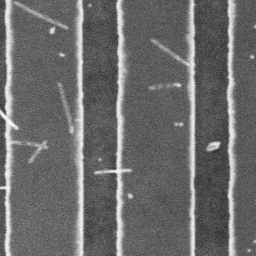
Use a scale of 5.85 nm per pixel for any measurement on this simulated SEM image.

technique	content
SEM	lines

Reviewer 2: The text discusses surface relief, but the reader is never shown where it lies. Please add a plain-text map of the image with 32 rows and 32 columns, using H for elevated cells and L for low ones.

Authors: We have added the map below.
LHHHHHHHHHLLLLLHHHHHHHHHLLLLLHHH
LHHHHHHHHHLLLLLHHHHHHHHHLLLLLHHH
LHHHHHHHHHLLLLLHHHHHHHHHLLLLLHHH
LHHHHHHHHHLLLLLHHHHHHHHHLLLLLHHH
LHHHHHHHHHLLLLLHHHHHHHHHLLLLLHHH
LHHHHHHHHHLLLLLHHHHHHHHHLLLLLHHH
LHHHHHHHHHLLLLLHHHHHHHHHLLLLLHHH
LHHHHHHHHHLLLLLHHHHHHHHHLLLLLHHH
LHHHHHHHHHLLLLLHHHHHHHHHLLLLLHHH
LHHHHHHHHHLLLLLHHHHHHHHHLLLLLHHH
LHHHHHHHHHLLLLLHHHHHHHHHLLLLLHHH
LHHHHHHHHHLLLLLHHHHHHHHHLLLLLHHH
LHHHHHHHHHLLLLLHHHHHHHHHLLLLLHHH
LHHHHHHHHHLLLLLHHHHHHHHHLLLLLHHH
LHHHHHHHHHLLLLLHHHHHHHHHLLLLLHHH
LHHHHHHHHHLLLLLHHHHHHHHHLLLLLHHH
LHHHHHHHHHLLLLLHHHHHHHHHLLLLLHHH
LHHHHHHHHHLLLLLHHHHHHHHHLLLLLHHH
LHHHHHHHHHLLLLLHHHHHHHHHLLLLLHHH
LHHHHHHHHHLLLLLHHHHHHHHHLLLLLHHH
LHHHHHHHHHLLLLLHHHHHHHHHLLLLLHHH
LHHHHHHHHHLLLLLHHHHHHHHHLLLLLHHH
LHHHHHHHHHLLLLLHHHHHHHHHLLLLLHHH
LHHHHHHHHHLLLLLHHHHHHHHHLLLLLHHH
LHHHHHHHHHLLLLLHHHHHHHHHLLLLLHHH
LHHHHHHHHHLLLLLHHHHHHHHHLLLLLHHH
LHHHHHHHHHLLLLLHHHHHHHHHLLLLLHHH
LHHHHHHHHHLLLLLHHHHHHHHHLLLLLHHH
LHHHHHHHHHLLLLLHHHHHHHHHLLLLLHHH
LHHHHHHHHHLLLLLHHHHHHHHHLLLLLHHH
LHHHHHHHHHLLLLLHHHHHHHHHLLLLLHHH
LHHHHHHHHHLLLLLHHHHHHHHHLLLLLHHH